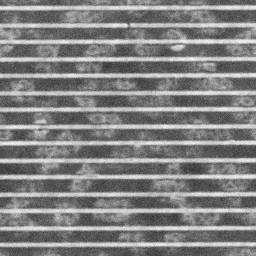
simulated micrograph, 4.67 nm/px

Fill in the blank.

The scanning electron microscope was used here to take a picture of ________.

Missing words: parallel lines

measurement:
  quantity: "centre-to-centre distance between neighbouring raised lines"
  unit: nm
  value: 79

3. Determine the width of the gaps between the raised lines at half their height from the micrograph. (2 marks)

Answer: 64.2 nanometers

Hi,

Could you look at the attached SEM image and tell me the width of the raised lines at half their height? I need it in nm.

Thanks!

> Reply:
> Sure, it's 12.8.